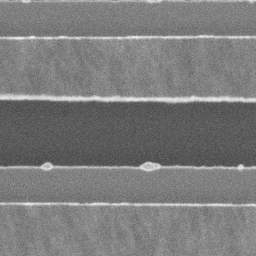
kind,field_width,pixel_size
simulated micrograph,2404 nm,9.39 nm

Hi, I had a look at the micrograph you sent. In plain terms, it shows lines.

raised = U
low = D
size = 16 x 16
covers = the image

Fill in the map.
UUUUUUUUUUUUUUUU
UUUUUUUUUUUUUUUU
UUUUUUUUUUUUUUUU
UUUUUUUUUUUUUUUU
UUUUUUUUUUUUUUUU
UUUUUUUUUUUUUUUU
DDDDDDDDDDDDDDDD
DDDDDDDDDDDDDDDD
DDDDDDDDDDDDDDDD
DDDDDDDDDDDDDDDD
UUUUUUUUUUUUUUUU
UUUUUUUUUUUUUUUU
UUUUUUUUUUUUUUUU
UUUUUUUUUUUUUUUU
UUUUUUUUUUUUUUUU
UUUUUUUUUUUUUUUU